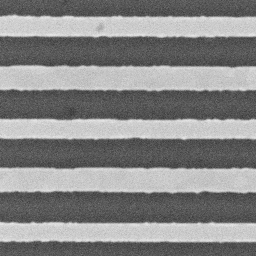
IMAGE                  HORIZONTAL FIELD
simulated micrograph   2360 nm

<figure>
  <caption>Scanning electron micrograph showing lines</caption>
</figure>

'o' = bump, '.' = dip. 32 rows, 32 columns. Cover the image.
................................
................................
oooooooooooooooooooooooooooooooo
oooooooooooooooooooooooooooooooo
...........o.......oo..oooo.....
................................
................................
................................
oooooooooooooooooooooooooooooooo
oooooooooooooooooooooooooooooooo
oooooooooooooooooooooooooooooooo
................................
................................
................................
................................
oooooooooooooooooooooooooooooooo
oooooooooooooooooooooooooooooooo
................................
................................
................................
................................
oooooooooooooooooooooooooooooooo
oooooooooooooooooooooooooooooooo
oooooooooooooooooooooooooooooooo
................................
................................
................................
................................
oooooooooooooooooooooooooooooooo
oooooooooooooooooooooooooooooooo
................................
................................